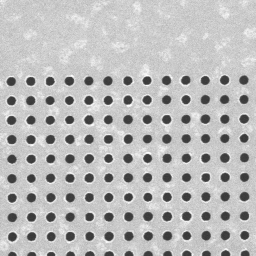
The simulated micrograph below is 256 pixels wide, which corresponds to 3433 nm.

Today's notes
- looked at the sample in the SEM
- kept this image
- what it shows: a regular array of holes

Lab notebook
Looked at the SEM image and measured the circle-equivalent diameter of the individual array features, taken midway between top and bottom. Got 127 nm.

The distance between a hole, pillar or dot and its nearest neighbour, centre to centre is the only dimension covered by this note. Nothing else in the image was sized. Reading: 258 nm